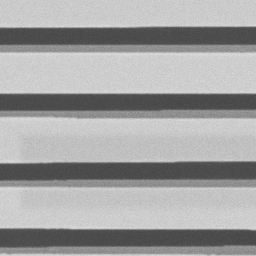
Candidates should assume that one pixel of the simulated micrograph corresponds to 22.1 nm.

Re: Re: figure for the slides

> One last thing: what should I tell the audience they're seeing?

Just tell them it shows lines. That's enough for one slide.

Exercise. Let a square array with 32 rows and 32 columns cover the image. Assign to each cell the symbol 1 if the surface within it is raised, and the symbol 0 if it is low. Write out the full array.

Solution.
11111111111111111111111111111111
11111111111111111111111111111111
11111111111111111111111111111111
00000000000000000000000000000000
00000000000000000000000000000000
00000000000000000000000000000000
11111111111111111111111111111111
11111111111111111111111111111111
11111111111111111111111111111111
11111111111111111111111111111111
11111111111111111111111111111111
11111111111111111111111111111111
00000000000000000000000000000000
00000000000000000000000000000000
11111111111111111111111111111111
11111111111111111111111111111111
11111111111111111111111111111111
11111111111111111111111111111111
11111111111111111111111111111111
11111111111111111111111111111111
00000000000000000000000000000000
00000000000000000000000000000000
00000000000000000000000000000000
11111111111111111111111111111111
11111111111111111111111111111111
11111111111111111111111111111111
11111111111111111111111111111111
11111111111111111111111111111111
00000111111111111111111111111111
00000000000000000000000000000000
00000000000000000000000000000000
11111111111111111111111111111111